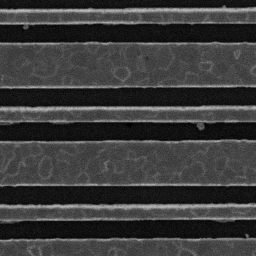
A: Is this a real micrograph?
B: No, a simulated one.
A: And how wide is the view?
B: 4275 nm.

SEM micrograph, lines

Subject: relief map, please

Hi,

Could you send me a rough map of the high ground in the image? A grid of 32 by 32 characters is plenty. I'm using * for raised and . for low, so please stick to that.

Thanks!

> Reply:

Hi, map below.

................................
********************************
********************************
................................
................................
****************************.***
********************************
********************************
********************************
********************************
********************************
................................
................................
********************************
********************************
................................
................................
................................
********************************
********************************
********************************
********************************
********************************
................................
................................
................................
********************************
*****************...............
................................
................................
********************************
********************************